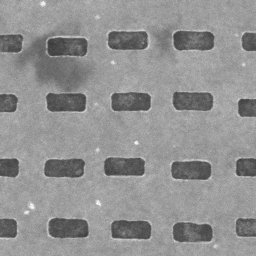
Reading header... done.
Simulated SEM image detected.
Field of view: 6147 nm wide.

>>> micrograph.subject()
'a regular array of holes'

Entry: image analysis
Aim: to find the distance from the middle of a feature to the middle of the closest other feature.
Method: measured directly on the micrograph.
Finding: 1450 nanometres